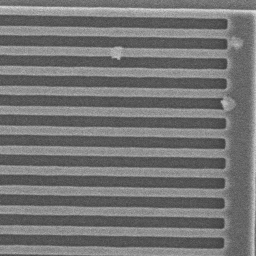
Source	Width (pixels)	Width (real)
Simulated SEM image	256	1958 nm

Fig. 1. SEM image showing groups of lines, slits or small figures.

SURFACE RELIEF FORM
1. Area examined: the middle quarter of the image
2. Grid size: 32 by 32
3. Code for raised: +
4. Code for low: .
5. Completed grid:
................................
++++++++++++++++++++++++++++++++
++++++++++++++++++++++++++++++++
................................
................................
................................
++++++++++++++++++++++++++++++++
++++++++++++++++++++++++++++++++
................................
................................
................................
++++++++++++++++++++++++++++++++
++++++++++++++++++++++++++++++++
................................
................................
................................
++++++++++++++++++++++++++++++++
++++++++++++++++++++++++++++++++
................................
................................
................................
++++++++++++++++++++++++++++++++
++++++++++++++++++++++++++++++++
................................
................................
................................
++++++++++++++++++++++++++++++++
++++++++++++++++++++++++++++++++
................................
................................
................................
++++++++++++++++++++++++++++++++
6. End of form